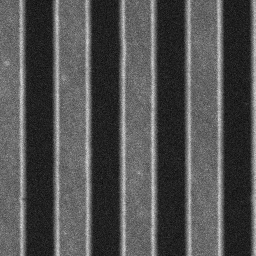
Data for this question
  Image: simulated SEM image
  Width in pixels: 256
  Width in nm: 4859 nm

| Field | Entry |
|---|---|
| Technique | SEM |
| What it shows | one or a few lines or trenches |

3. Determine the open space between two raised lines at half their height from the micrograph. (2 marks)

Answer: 0.61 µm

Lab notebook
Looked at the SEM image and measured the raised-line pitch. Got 1250 nm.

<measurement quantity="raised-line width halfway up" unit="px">33.9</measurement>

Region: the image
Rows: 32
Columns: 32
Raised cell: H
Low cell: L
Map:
HHHLLLLHHHHLLLLHHHHLLLLHHHHHLLLL
HHHLLLLHHHHLLLLHHHHLLLLHHHHHLLLL
HHHLLLLHHHHLLLLHHHHLLLLHHHHHLLLL
HHHLLLLHHHHLLLLHHHHLLLLHHHHHLLLL
HHHLLLLHHHHLLLLHHHHLLLLHHHHHLLLL
HHHLLLLHHHHLLLLHHHHLLLLHHHHHLLLL
HHHLLLLHHHHLLLLHHHHLLLLHHHHHLLLL
HHHLLLLHHHHLLLLHHHHLLLLHHHHHLLLL
HHHLLLLHHHHLLLLHHHHLLLLHHHHHLLLL
HHHLLLLHHHHLLLLHHHHLLLLHHHHHLLLL
HHHLLLLHHHHLLLLHHHHLLLLHHHHHLLLL
HHHLLLLHHHHLLLLHHHHLLLLHHHHHLLLL
HHHLLLLHHHHLLLLHHHHLLLLHHHHHLLLL
HHHLLLLHHHHLLLLHHHHLLLLHHHHHLLLL
HHHLLLLHHHHLLLLHHHHLLLLHHHHHLLLL
HHHLLLLHHHHLLLLHHHHLLLLHHHHHLLLL
HHHLLLLHHHHLLLLHHHHLLLLHHHHHLLLL
HHHLLLLHHHHLLLLHHHHLLLLHHHHHLLLL
HHHLLLLHHHHLLLLHHHHLLLLHHHHHLLLL
HHHLLLLHHHHLLLLHHHHLLLLHHHHHLLLL
HHHLLLLHHHHLLLLHHHHLLLLHHHHHLLLL
HHHLLLLHHHHLLLLHHHHLLLLHHHHHLLLL
HHHLLLLHHHHLLLLHHHHLLLLHHHHHLLLL
HHHLLLLHHHHLLLLHHHHLLLLHHHHHLLLL
HHHLLLLHHHHLLLLHHHHLLLLLHHHHLLLL
HHHLLLLHHHHLLLLHHHHLLLLLHHHHLLLL
HHHLLLLHHHHLLLLHHHHLLLLLHHHHLLLL
HHHLLLLHHHHLLLLHHHHLLLLLHHHHLLLL
HHHLLLLHHHHLLLLHHHHLLLLLHHHHLLLL
HHHLLLLHHHHLLLLHHHHLLLLLHHHHLLLL
HHHLLLLHHHHLLLLHHHHLLLLLHHHHLLLL
HHHLLLLHHHHLLLLHHHHLLLLLHHHHLLLL